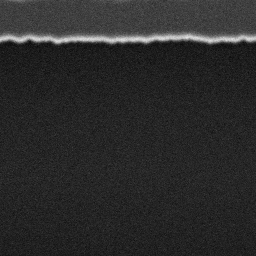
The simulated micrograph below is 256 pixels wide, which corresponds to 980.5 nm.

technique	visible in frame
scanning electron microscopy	lines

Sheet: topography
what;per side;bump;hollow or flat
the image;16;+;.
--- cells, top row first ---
++++++++++++++++
++++++++++++++++
.+++++++++..+++.
................
................
................
................
................
................
................
................
................
................
................
................
................